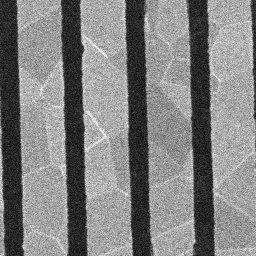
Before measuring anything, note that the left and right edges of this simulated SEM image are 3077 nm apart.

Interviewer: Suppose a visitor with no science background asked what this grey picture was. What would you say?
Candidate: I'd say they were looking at one or a few lines or trenches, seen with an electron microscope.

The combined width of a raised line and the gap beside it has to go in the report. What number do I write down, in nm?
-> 762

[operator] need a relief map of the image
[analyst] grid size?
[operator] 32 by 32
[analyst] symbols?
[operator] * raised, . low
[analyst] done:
..******..******..*****...*****.
..******..******..*****...*****.
..******..******..******..*****.
..******..******..******..*****.
..******..******..******..*****.
..******..******..******..******
..******..******..******..******
..******..******..******..******
..******..******..******..******
..******..******..******..******
...*****..******..******..******
...*****..******..******..******
...*****..******..******..******
...*****..******..******..******
...*****..******..******..******
...*****...*****...*****..******
...*****...*****...*****..******
...*****...*****...*****..******
...*****...*****...*****...*****
...*****...*****...*****...*****
...*****...*****...*****...*****
...*****...*****...*****...*****
...*****...*****...*****...*****
...*****...*****...*****...*****
...*****...*****...*****...*****
...*****...*****...*****...*****
...*****...*****...*****...*****
...*****...*****...*****...*****
...*****...*****...*****...*****
...*****...*****...*****...*****
...*****...*****...*****...*****
*..*****...*****...*****...*****